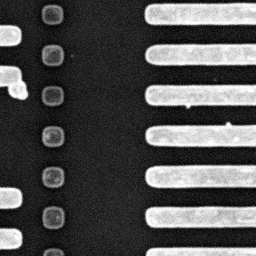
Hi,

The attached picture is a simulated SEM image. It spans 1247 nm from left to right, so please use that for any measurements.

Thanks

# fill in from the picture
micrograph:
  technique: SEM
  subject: wiring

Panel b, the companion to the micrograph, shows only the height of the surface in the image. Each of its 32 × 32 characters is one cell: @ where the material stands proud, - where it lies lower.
--------------------------------
-----@@@----------@@@@@@@@@@@@@@
-----@@@----------@@@@@@@@@@@@@@
@@------------------------------
@@@-----------------------------
@@------------------------------
-----@@@----------@@@@@@@@@@@@@@
-----@@@----------@@@@@@@@@@@@@@
@@------------------------------
@@@-----------------------------
@@@-----------------------------
--@--@@@----------@@@@@@@@@@@@@@
-----@@@----------@@@@@@@@@@@@@@
--------------------------------
--------------------------------
--------------------------------
-----@@@----------@@@@@@@@@@@@@@
-----@@@----------@@@@@@@@@@@@@@
--------------------------------
--------------------------------
--------------------------------
------@@----------@@@@@@@@@@@@@@
-----@@@----------@@@@@@@@@@@@@@
--------------------------------
@@@-----------------------------
@@@-----------------------------
------@@----------@@@@@@@@@@@@@@
-----@@@----------@@@@@@@@@@@@@@
--------------------------------
@@@-----------------------------
@@@-----------------------------
------@@-----------@@@@@@@@@@@@@